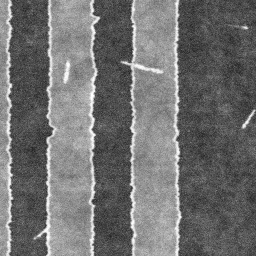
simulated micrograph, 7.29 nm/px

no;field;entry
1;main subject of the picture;one or a few lines or trenches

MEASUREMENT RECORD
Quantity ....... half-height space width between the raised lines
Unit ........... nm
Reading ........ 290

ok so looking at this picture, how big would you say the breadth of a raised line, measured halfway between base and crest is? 323 nanometres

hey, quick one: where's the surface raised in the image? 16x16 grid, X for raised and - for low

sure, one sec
X--XXX--XXX-----
X--XXX--XXX-----
X--XXX--XXX-----
X--XXX--XXX-----
X--XXX--XXX-----
X--XXX--XXX-----
X--XXX--XXX-----
X--XXX--XXX-----
X--XXX--XXX-----
X--XXX--XXX-----
X--XXX--XXX-----
X--XXX--XXX-----
X--XXX--XXX-----
X--XXX--XXX-----
X--XXX--XXX-----
X--XXX--XXX-----